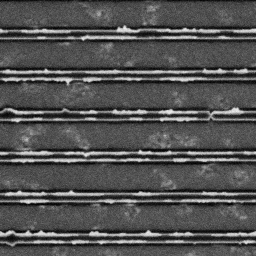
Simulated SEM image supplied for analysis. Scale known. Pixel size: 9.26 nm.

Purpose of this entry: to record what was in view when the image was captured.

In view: parallel lines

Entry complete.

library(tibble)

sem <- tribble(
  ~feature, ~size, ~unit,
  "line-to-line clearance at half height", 292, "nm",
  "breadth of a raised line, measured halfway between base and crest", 0.0856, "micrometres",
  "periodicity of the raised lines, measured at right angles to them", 376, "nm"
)